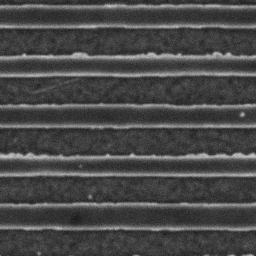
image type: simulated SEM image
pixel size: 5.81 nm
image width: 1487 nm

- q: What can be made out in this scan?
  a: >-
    lines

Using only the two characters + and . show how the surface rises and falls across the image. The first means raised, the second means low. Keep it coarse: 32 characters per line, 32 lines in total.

................................
++++++++++++++++++++++++++++++++
++++++++++++++++++++++++++++++++
................................
................................
................................
................................
++++++++++++++++++++++++++++++++
++++++++++++++++++++++++++++++++
+++++...........................
................................
................................
................................
++++++++++++++++++++++++++++++++
++++++++++++++++++++++++++++++++
++++++++++++++++++++++++++++++++
................................
................................
................................
................................
++++++++++++++++++++++++++++++++
++++++++++++++++++++++++++++++++
................................
................................
................................
.....+...+++++++++++..++.......+
++++++++++++++++++++++++++++++++
++++++++++++++++++++++++++++++++
++++++++++++++++++++++++++++++++
................................
................................
................................